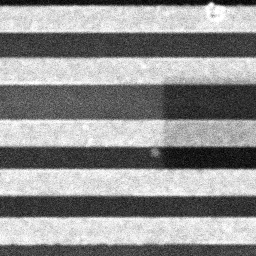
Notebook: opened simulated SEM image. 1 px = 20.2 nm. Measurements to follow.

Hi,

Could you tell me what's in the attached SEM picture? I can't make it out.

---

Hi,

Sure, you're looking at lines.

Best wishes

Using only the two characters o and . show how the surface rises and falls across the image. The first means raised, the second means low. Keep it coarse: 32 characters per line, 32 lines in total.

................................
oooooooooooooooooooooooooooooooo
oooooooooooooooooooooooooooooooo
oooooooooooooooooooooooooooooooo
................................
................................
................................
oooooooooooooooooooooooooooooooo
oooooooooooooooooooooooooooooooo
oooooooooooooooooooooooooooooooo
................................
................................
................................
................................
................................
oooooooooooooooooooooooooooooooo
oooooooooooooooooooooooooooooooo
oooooooooooooooooooooooooooooooo
................................
................................
................................
oooooooooooooooooooooooooooooooo
oooooooooooooooooooooooooooooooo
oooooooooooooooooooooooooooooooo
................................
................................
................................
oooooooooooooooooooooooooooooooo
oooooooooooooooooooooooooooooooo
oooooooooooooooooooooooooooooooo
................................
................................